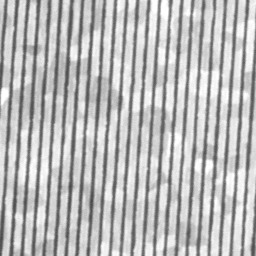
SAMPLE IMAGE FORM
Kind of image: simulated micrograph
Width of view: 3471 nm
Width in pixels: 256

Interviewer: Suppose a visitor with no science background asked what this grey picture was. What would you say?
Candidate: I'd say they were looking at parallel lines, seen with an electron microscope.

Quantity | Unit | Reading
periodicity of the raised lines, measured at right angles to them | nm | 149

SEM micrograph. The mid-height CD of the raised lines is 81.2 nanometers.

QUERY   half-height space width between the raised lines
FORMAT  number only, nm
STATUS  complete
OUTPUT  69.3